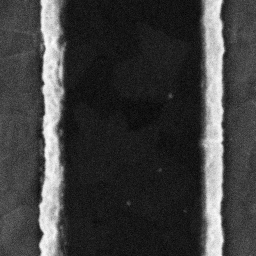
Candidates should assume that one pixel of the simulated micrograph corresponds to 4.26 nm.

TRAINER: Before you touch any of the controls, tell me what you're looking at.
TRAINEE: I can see one or a few lines or trenches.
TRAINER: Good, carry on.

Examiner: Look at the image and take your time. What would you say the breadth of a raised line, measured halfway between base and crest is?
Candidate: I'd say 0.706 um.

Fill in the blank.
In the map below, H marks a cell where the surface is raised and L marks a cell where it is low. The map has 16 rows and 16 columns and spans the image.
LLLHHHHHHHHHHLLL
LLLHHHHHHHHHHLLL
LLLHHHHHHHHHHLLL
LLLHHHHHHHHHHLLL
LLLHHHHHHHHHHLLL
LLLHHHHHHHHHHLLL
LLLHHHHHHHHHHLLL
LLLHHHHHHHHHHLLL
LLLHHHHHHHHHHHLL
LLLHHHHHHHHHHLLL
LLLHHHHHHHHHHLLL
LLLHHHHHHHHHHLLL
LLLHHHHHHHHHHLLL
LLLHHHHHHHHHHLLL
LLLHHHHHHHHHHLLL
LLLHHHHHHHHHHLLL